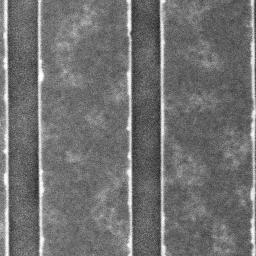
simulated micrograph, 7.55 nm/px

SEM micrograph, one or a few lines or trenches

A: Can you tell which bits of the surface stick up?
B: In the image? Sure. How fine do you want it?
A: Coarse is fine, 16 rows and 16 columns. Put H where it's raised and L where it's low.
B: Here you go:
LLHHHHHHLLHHHHHH
LLHHHHHHLLHHHHHH
LLHHHHHHLLHHHHHH
LLHHHHHHLLHHHHHH
LLHHHHHHLLHHHHHH
LLHHHHHHLLHHHHHH
LLHHHHHHLLHHHHHH
LLHHHHHHLLHHHHHH
LLLHHHHHLLHHHHHH
LLLHHHHHLLHHHHHH
LLLHHHHHLLHHHHHH
LLLHHHHHLLHHHHHH
LLLHHHHHLLHHHHHH
LLLHHHHHLLHHHHHH
LLLHHHHHLLHHHHHH
LLLHHHHHLLHHHHHH